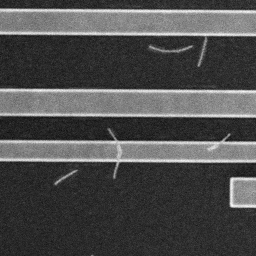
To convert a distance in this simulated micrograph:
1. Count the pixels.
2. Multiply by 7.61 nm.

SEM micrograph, groups of lines, slits or small figures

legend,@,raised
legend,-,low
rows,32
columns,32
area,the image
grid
--------------------------------
@@@@@@@@@@@@@@@@@@@@@@@@@@@@@@@@
@@@@@@@@@@@@@@@@@@@@@@@@@@@@@@@@
@@@@@@@@@@@@@@@@@@@@@@@@@@@@@@@@
--------------------------------
--------------------------------
--------------------------------
--------------------------------
--------------------------------
--------------------------------
--------------------------------
@@@@@@@@@@@@@@@@@@@@@@@@@@@@@@@@
@@@@@@@@@@@@@@@@@@@@@@@@@@@@@@@@
@@@@@@@@@@@@@@@@@@@@@@@@@@@@@@@@
------------------@@@@@@@@@@@@@@
--------------------------------
--------------------------------
--------------------------------
@@@@@@@@@@@@@@@@@@@@@@@@@@@@@@@@
@@@@@@@@@@@@@@@@@@@@@@@@@@@@@@@@
--------------------------------
--------------------------------
-----------------------------@@@
-----------------------------@@@
-----------------------------@@@
-----------------------------@@@
--------------------------------
--------------------------------
--------------------------------
--------------------------------
--------------------------------
--------------------------------